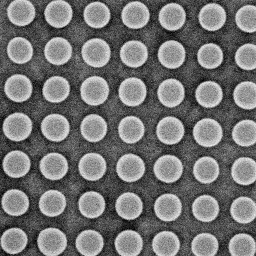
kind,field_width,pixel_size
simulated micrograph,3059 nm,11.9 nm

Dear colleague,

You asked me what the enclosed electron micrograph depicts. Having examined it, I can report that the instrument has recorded an array of small figures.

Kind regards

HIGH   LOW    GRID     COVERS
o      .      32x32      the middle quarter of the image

.......oo.......ooo......oooo...
................................
................................
......ooo.......................
o....ooooo.....ooooo.....oooo...
o...ooooooo...oooooo....oooooo..
o...ooooooo...oooooo....oooooo..
o...ooooooo...oooooo....oooooo..
.....oooooo...oooooo....oooooo..
.....ooooo.....oooo.....ooooo...
..........................oo....
................................
................................
.....oooo......ooo.......ooo....
o....ooooo....ooooo.....ooooo...
o...ooooooo...oooooo...ooooooo..
o...ooooooo...oooooo...ooooooo..
o....ooooo....oooooo...ooooooo..
.....ooooo....ooooo.....ooooo...
................oo.......ooo....
................................
................................
......oo........................
.....ooooo....ooooo.....oooo....
o...oooooo....oooooo...oooooo...
o...oooooo...ooooooo...oooooo...
o...oooooo...ooooooo...oooooo...
....oooooo....oooooo...oooooo...
.....oooo.....ooooo.....ooooo...
................................
................................
................................